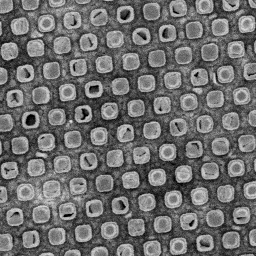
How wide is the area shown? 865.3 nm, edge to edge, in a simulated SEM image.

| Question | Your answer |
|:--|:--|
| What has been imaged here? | a regular array of raised bodies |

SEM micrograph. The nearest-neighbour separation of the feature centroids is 0.0887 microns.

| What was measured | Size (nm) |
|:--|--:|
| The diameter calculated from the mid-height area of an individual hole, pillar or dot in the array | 57.9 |